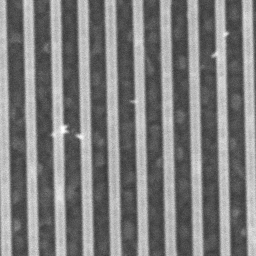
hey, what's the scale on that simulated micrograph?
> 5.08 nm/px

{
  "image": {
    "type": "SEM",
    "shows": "parallel lines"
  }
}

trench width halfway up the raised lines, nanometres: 95.2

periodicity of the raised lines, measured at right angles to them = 0.139 um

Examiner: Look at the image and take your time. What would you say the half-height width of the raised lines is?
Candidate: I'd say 45.1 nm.